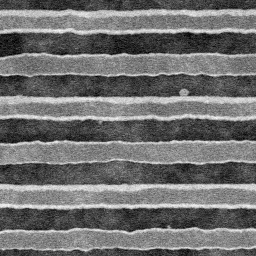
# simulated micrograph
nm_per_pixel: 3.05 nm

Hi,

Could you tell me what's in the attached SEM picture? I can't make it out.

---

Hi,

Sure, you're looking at lines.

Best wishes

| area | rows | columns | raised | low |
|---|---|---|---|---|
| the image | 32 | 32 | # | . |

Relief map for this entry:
................................
.#......#........#######..######
################################
################################
................................
................................
................................
################################
################################
...#.........#..................
................................
................................
################################
################################
################################
................................
................................
................................
################################
################################
#......#................#.......
................................
................................
################################
################################
################################
................................
................................
........................#.......
################################
################################
................................